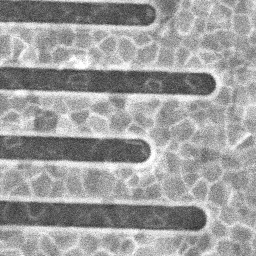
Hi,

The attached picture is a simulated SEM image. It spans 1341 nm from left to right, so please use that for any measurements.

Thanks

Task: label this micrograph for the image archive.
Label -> one or a few lines or trenches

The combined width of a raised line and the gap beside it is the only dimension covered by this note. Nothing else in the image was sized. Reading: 355 nm